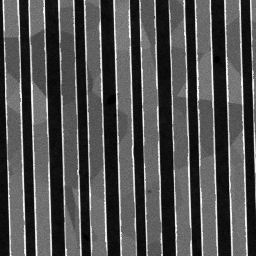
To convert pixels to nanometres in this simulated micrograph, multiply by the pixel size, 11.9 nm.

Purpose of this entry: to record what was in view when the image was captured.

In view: parallel lines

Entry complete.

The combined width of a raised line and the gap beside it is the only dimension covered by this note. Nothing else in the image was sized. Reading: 0.329 micrometres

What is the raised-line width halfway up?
190 nanometres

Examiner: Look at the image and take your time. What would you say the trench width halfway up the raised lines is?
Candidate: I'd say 9.93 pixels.